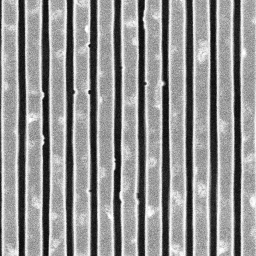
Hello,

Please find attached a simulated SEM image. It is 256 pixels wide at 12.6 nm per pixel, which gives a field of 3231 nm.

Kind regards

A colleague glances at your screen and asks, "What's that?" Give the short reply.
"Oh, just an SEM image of parallel lines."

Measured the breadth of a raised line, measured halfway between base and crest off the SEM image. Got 218 nm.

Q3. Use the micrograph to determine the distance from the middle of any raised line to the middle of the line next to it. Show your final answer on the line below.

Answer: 302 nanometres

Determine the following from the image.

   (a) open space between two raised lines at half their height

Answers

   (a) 91.5 nm